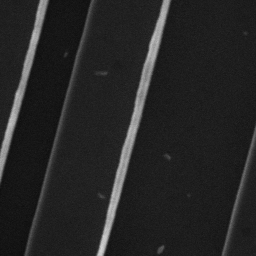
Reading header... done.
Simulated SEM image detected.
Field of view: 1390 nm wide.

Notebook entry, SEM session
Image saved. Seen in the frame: lines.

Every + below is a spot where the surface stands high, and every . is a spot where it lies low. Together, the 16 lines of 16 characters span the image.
+++...+++++.....
+++..+++++......
++...+++++......
++...+++++......
++...++++.......
++..+++++.......
+...+++++.......
+...+++++.......
+..+++++........
...+++++........
...+++++.......+
...+++++.......+
..+++++........+
..+++++........+
..+++++.......++
..+++++.......++